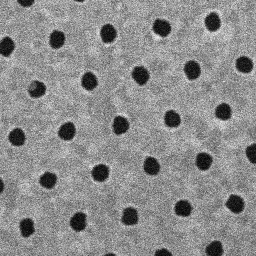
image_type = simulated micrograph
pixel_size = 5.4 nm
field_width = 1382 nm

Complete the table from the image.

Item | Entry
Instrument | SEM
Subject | a regular array of holes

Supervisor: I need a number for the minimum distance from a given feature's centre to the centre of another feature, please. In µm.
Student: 0.278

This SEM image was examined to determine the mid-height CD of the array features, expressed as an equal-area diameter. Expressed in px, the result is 19.1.